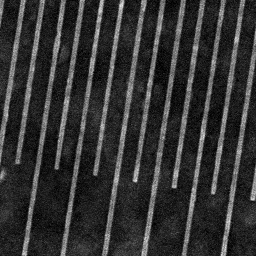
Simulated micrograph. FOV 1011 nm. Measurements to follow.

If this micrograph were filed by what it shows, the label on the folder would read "parallel lines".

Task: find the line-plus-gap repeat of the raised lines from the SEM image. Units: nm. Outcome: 77.8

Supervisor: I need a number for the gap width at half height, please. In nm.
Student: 61.9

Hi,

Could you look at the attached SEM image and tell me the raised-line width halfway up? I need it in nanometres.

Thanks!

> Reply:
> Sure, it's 17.